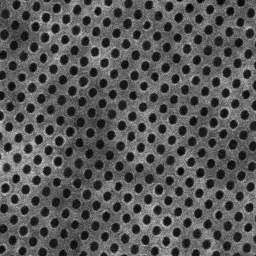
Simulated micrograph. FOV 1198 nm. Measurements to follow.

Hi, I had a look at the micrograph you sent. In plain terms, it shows a regular array of holes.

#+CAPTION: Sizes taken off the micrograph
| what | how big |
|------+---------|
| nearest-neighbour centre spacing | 66.2 nanometres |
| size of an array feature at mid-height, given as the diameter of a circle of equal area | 41.9 nm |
